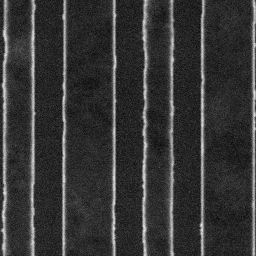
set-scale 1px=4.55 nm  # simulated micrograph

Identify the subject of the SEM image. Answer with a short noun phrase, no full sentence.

lines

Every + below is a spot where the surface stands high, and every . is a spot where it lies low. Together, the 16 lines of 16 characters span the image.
++..+++..++..+++
++..+++..++..+++
++..+++..++..+++
++..+++..++..+++
++..+++..++..+++
++..+++..++..+++
++..+++..++..+++
++..+++..++..+++
++..+++..++..+++
++..+++..++..+++
++..+++..++..+++
++..+++..++..+++
++..+++..++..+++
++..+++..++..+++
++..+++..++..+++
++..+++..++..+++